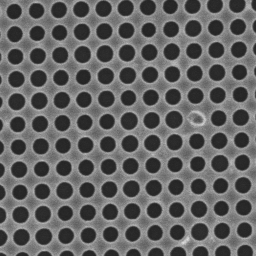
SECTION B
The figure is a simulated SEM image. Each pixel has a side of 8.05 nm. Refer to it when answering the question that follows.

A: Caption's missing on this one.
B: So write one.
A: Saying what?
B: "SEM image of a regular array of holes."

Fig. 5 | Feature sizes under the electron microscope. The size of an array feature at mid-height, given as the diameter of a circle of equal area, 132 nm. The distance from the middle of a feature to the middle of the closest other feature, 179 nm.